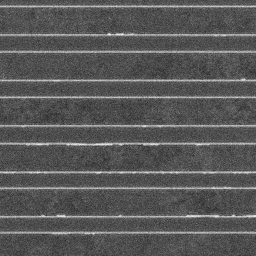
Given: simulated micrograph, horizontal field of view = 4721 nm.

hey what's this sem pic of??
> lines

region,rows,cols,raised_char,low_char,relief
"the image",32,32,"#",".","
################################
................................
................................
................................
################################
################################
................................
................................
................................
................................
################################
################################
................................
................................
................................
................................
################################
################################
................................
................................
................................
................................
################################
################################
................................
................................
................................
################################
################################
................................
................................
................................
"